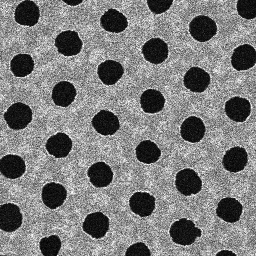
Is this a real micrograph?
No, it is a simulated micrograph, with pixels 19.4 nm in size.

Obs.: a regular array of holes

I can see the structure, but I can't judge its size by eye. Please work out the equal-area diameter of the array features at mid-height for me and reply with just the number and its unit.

0.494 um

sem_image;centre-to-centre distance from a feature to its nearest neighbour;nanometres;974